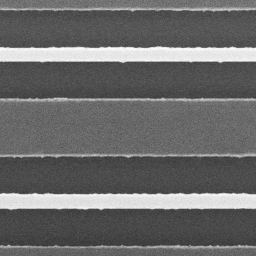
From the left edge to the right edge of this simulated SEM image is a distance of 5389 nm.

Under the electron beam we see lines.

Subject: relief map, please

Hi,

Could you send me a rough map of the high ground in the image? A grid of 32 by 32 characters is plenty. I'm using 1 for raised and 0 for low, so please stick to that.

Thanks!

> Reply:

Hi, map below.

11111111111111111111111111111111
00000000000000000000000000000000
00000000000000000000000000000000
00000000000000000000000000000000
00000000000000000000000000000000
00000000000000000000000000000000
11111111111111111111111111111111
11111111111111111111111111111111
00000000000000000000000000000000
00000000000000000000000000000000
00000000000000000000000000000000
00000000000000000000000000000000
11111111111111111111111111111111
11111111111111111111111111111111
11111111111111111111111111111111
11111111111111111111111111111111
11111111111111111111111111111111
11111111111111111111111111111111
11111111111111111111111111111111
11110111010000011000000000000110
00000000000000000000000000000000
00000000000000000000000000000000
00000000000000000000000000000000
00000000000000000000000000000000
11111111111111111111111111111111
11111111111111111111111111111111
00000000000000000000000000000000
00000000000000000000000000000000
00000000000000000000000000000000
00000000000000000000000000000000
00000000000000000000000000000000
11111111111111111111111111111111